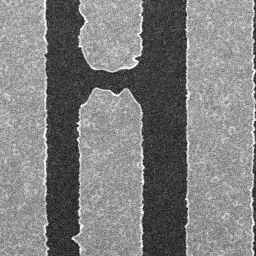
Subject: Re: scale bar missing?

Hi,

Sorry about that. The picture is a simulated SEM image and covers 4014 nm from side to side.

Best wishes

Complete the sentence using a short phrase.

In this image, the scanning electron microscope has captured one or a few lines or trenches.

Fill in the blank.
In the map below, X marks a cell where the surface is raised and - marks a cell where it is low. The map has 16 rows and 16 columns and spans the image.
XXX--XXXX---XXXX
XXX--XXXX---XXXX
XXX--XXXX---XXXX
XXX--XXXX---XXXX
XXX---------XXXX
XXX---------XXXX
XXX--XXXX---XXXX
XXX--XXXX---XXXX
XXX--XXXX---XXXX
XXX--XXXX---XXXX
XXX--XXXX---XXXX
XXX--XXXX---XXXX
XXX--XXXX---XXXX
XXX--XXXX---XXXX
XXX--XXXX---XXXX
XXX--XXXX---XXXX